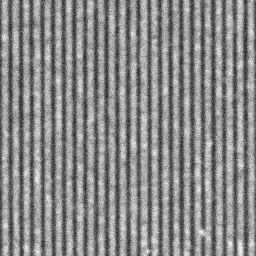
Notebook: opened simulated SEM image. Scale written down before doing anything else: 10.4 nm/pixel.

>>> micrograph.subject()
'parallel lines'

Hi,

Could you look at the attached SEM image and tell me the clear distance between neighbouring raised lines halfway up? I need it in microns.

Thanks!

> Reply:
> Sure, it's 0.056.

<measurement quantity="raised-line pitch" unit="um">0.111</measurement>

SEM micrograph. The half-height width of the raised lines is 56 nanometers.